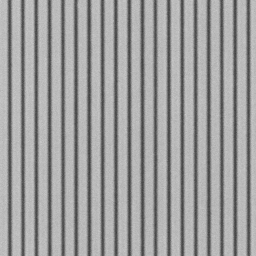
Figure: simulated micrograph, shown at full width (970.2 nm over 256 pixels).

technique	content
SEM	parallel lines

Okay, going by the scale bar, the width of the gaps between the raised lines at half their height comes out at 12.8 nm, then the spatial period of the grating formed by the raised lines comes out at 13.3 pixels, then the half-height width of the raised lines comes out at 10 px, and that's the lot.